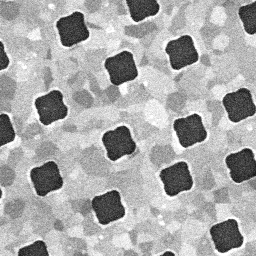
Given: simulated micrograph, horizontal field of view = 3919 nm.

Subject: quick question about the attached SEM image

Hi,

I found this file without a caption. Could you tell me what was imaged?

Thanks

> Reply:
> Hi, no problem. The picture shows a regular array of holes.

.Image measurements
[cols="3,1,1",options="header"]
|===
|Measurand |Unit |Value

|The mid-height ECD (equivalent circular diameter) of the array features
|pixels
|33.2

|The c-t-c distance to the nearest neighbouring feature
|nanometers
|977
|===